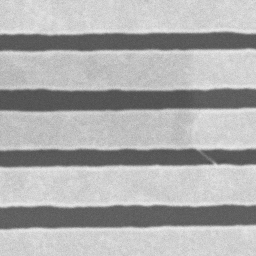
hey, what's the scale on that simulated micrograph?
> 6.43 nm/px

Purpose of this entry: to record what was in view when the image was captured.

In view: lines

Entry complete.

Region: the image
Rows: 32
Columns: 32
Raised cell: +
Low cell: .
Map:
++++++++++++++++++++++++++++++++
++++++++++++++++++++++++++++++++
++++++++++++++++++++++++++++++++
++++++++++++++++++++++++++++++++
................................
................................
++++++++++++++++++++++++++++++++
++++++++++++++++++++++++++++++++
++++++++++++++++++++++++++++++++
++++++++++++++++++++++++++++++++
++++++++++++++++++++++++++++++++
................................
................................
................................
++++++++++++++++++++++++++++++++
++++++++++++++++++++++++++++++++
++++++++++++++++++++++++++++++++
++++++++++++++++++++++++++++++++
++++++++++++++++++++++++++++++++
................................
................................
++++++++++++++++++++++++++++++++
++++++++++++++++++++++++++++++++
++++++++++++++++++++++++++++++++
++++++++++++++++++++++++++++++++
++++++++++++++++++++++++++++.+++
................................
................................
................+.++++++++++++++
++++++++++++++++++++++++++++++++
++++++++++++++++++++++++++++++++
++++++++++++++++++++++++++++++++